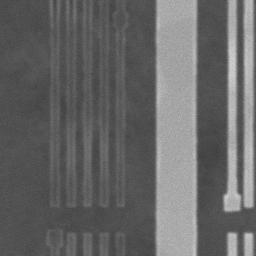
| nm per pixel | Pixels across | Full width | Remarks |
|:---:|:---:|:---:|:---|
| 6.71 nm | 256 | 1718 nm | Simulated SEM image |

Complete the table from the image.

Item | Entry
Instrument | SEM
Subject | wiring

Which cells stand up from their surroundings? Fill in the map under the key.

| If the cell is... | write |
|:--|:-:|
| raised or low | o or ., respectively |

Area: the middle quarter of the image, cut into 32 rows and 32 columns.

.oo..oo..oo..oo........ooooooooo
.oo..oo..oo..oo........ooooooooo
.oo..oo..oo..oo........ooooooooo
.oo..oo..oo..oo........ooooooooo
.oo..oo..oo..oo........oo.oooooo
.oo..oo..oo..oo........o.....ooo
.oo..oo..oo..oo........o......oo
.oo..oo..oo..oo...............oo
.oo..oo..oo..oo..............ooo
.oo..oo..oo..oo..............ooo
.oo..oo..oo..oo.........oooooooo
.oo..oo..oo..oo........ooooooooo
.oo..oo..oo..oo........ooooooooo
.oo..oo..oo..oo........ooooooooo
.oo..oo..oo..oo........ooooooooo
.oo..oo..oo..oo........ooooooooo
.oo..oo..oo..oo........ooooooooo
.oo..oo..oo..oo........ooooooooo
.oo..oo..oo..oo........ooooooooo
.oo..oo..oo..oo........ooooooooo
.oo..oo..oo..oo........ooooooooo
.oo..oo..oo..oo........oooooooo.
.oo..oo..oo..oo........ooooooo..
.oo..oo..oo..oo........ooooooo..
.oo..oo..oo..oo........ooooooooo
.oo..oo..oo..oo........ooooooooo
.oo..oo..oo..oo........ooooooooo
.oo..oo..oo..oo........ooooooooo
.oo..oo..oo..oo........ooooooooo
.oo..oo..oo..oo........ooooooooo
.oo..oo..oo..oo........ooooooooo
.oo..oo..oo..oo........ooooooooo